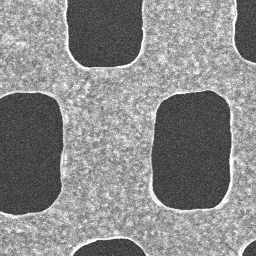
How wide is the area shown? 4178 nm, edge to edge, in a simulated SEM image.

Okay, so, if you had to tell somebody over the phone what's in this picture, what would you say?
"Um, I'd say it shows holes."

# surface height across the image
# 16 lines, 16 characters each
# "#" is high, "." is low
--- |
####.....######.
####.....######.
####.....######.
#####....######.
################
################
....######....##
....######....##
....######....##
....#####.....##
....#####.....##
....#####.....##
...#######....##
################
################
#####....######.